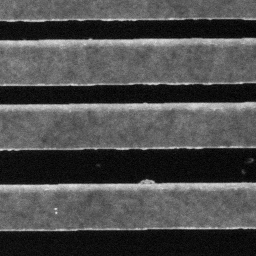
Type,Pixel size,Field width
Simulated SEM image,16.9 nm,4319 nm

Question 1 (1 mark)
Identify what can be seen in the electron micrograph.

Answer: lines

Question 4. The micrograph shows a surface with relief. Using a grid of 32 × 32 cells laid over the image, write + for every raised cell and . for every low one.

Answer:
++++++++++++++++++++++++++++++++
++++++++++++++++++++++++++++++++
+++++++++++.+++++...............
................................
................................
++++++++++++++++++++++++++++++++
++++++++++++++++++++++++++++++++
++++++++++++++++++++++++++++++++
++++++++++++++++++++++++++++++++
++++++++++++++++++++++++++++++++
+++++++++++++++++.++.+++.++.....
................................
................................
++++++++++++++++++++++++++++++++
++++++++++++++++++++++++++++++++
++++++++++++++++++++++++++++++++
++++++++++++++++++++++++++++++++
++++++++++++++++++++++++++++++++
++++++++++++++++++++++++++......
................................
................................
................................
................................
++++++++++++++++++++++++++++++++
++++++++++++++++++++++++++++++++
++++++++++++++++++++++++++++++++
++++++++++++++++++++++++++++++++
++++++++++++++++++++++++++++++++
++++++++++++++++++++++++++++++++
................................
................................
................................